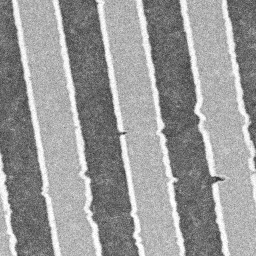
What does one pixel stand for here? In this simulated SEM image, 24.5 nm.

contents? one or a few lines or trenches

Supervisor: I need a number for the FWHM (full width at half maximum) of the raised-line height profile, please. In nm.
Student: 966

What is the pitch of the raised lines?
2030 nm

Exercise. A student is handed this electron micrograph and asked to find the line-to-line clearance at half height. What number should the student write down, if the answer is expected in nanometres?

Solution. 1060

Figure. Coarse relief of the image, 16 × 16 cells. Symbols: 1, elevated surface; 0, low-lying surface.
0111001110001100
0111001110001100
0111000110001100
0011000110001110
0011000110001110
0011000111001110
0011100111001110
0011100111000110
0011100011000110
0001100011000111
0001100011000111
0001100011100011
0001100011100011
0001110011100011
1001110001100011
1000110001100011